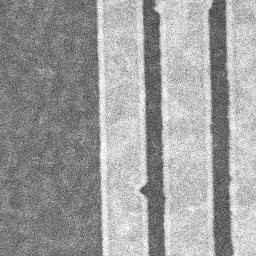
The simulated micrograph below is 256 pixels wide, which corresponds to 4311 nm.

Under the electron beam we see one or a few lines or trenches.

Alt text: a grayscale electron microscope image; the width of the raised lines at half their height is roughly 718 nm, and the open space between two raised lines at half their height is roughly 370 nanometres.